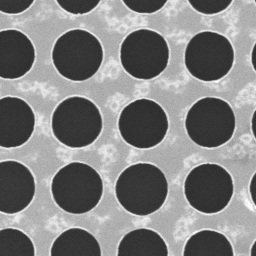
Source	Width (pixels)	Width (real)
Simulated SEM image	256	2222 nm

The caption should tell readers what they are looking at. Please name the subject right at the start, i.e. a regular array of holes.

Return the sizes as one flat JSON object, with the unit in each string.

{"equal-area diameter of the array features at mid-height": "437 nm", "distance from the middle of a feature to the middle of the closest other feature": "565 nanometres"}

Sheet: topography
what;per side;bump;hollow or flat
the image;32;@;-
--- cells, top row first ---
----@@@-----@@@@-----@@@-----@@@
---@@@@@---@@@@@@--@@@@@@--@@@@@
@@@@@@@@@@@@@@@@@@@@@@@@@@@@@@@@
@@@@@@@@@@@@@@@@@@@@@@@@@@@@@@@@
---@@@@@----@@@@----@@@@----@@@@
----@@@------@@------@@------@@@
----@@@------@@------@@------@@-
----@@@------@@------@@------@@-
----@@@-----@@@------@@------@@@
---@@@@@----@@@@@---@@@@----@@@@
@@@@@@@@@@@@@@@@@@@@@@@@@@@@@@@@
@@@@@@@@@@@@@@@@@@@@@@@@@@@@@@@@
---@@@@@---@@@@@@--@@@@@@---@@@@
----@@@-----@@@@----@@@@-----@@@
----@@@------@@------@@------@@@
----@@-------@@------@@------@@-
----@@@------@@------@@------@@@
---@@@@-----@@@@----@@@@-----@@@
@@@@@@@@@-@@@@@@@--@@@@@@@@@@@@@
@@@@@@@@@@@@@@@@@@@@@@@@@@@@@@@@
---@@@@@---@@@@@@--@@@@@@@-@@@@@
----@@@-----@@@-----@@@@----@@@@
----@@@------@@------@@------@@-
----@@-------@-------@@------@@-
----@@@------@@------@@------@@-
----@@@-----@@@-----@@@@----@@@@
--@@@@@@---@@@@@---@@@@@@--@@@@@
@@@@@@@@@@@@@@@@@@@@@@@@@@@@@@@@
@@@@@@@@@-@@@@@@@@@@@@@@@@@@@@@@
---@@@@-----@@@@----@@@@----@@@@
----@@@-----@@@------@@------@@@
----@@-------@@------@@------@@-